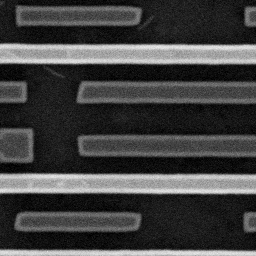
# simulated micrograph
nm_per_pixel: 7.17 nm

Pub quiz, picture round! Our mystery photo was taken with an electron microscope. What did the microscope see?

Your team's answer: wiring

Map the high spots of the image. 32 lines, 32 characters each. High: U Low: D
DDDDDDDDDDDDDDDDDDDDDDDDDDDDDDDD
DDUUUUUUUUUUUUUUUDDDDDDDDDDDDDDU
DDUUUUUUUUUUUUUUUDDDDDDDDDDDDDDU
DDDDDDDDDDDDDDDDDDDDDDDDDDDDDDDD
DDDDDDDDDDDDDDDDDDDDDDDDDDDDDDDD
DDDDDDDDDDDDDDDDDDDDDDDDDDDDDDDD
UUUUUUUUUUUUUUUUUUUUUUUUUUUUUUUU
UUUUUUUUUUUUUUUUUUUUUUUUUUUUUUUU
DDDDDDDDDDDDDDDDDDDDDDDDDDDDDDDD
DDDDDDDDDDDDDDDDDDDDDDDDDDDDDDDD
DDDDDDDDDDDUUUUUUDDDDDDDDDDDDDDD
UUUDDDDDDDUUUUUUUUUUUUUUUUUUUUUU
UUDDDDDDDDUUUUUUUUUUUUUUUUUUUUUU
DDDDDDDDDDDDDDDDDDDDDDDDDDDDDDDD
DDDDDDDDDDDDDDDDDDDDDDDDDDDDDDDD
DDDDDDDDDDDDDDDDDDDDDDDDDDDDDDDD
DUUDDDDDDDDDDDDDDDDDDDDDDDDDDDDD
UUUUDDDDDDUUUUUUUUUUUUUUUUUUUUUU
UUUUDDDDDDUUUUUUUUUUUUUUUUUUUUUU
UUUUDDDDDDDDDDDDDDDDDDDDDDDDDDDD
DDDDDDDDDDDDDDDDDDDDDDDDDDDDDDDD
DDDDDDDDDDDDDDDDDDDDDDDDDDDDDDDD
UUUUUUUUUUUUUUUUUUUUUUUUUUUUUUUU
UUUUUUUUUUUUUUUUUUUUUUUUUUUUUUUU
DDDDDDDDDDDDDDDDDDDDDDDDDDDDDDDD
DDDDDDDDDDDDDDDDDDDDDDDDDDDDDDDD
DDDDDDDDDDDDDDDDDDDDDDDDDDDDDDDD
DDUUUUUUUUUUUUUUUDDDDDDDDDDDDDDU
DDDUUUUUUUUUUUUUUDDDDDDDDDDDDDDU
DDDDDDDDDDDDDDDDDDDDDDDDDDDDDDDD
DDDDDDDDDDDDDDDDDDDDDDDDDDDDDDDD
DDDDDDDDDDDDDDDDDDDDDDDDDDDDDDDD